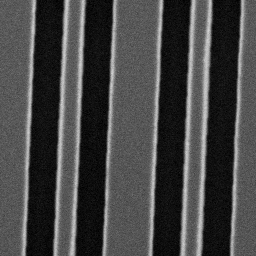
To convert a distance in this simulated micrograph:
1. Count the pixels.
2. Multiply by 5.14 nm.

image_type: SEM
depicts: lines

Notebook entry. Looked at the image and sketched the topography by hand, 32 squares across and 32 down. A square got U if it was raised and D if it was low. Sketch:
UUUUDDDDUUUDDDUUUUUUDDDDUUDDDDUU
UUUUDDDDUUUDDDUUUUUUDDDDUUDDDDUU
UUUUDDDDUUDDDDUUUUUUDDDDUUDDDDUU
UUUUDDDDUUDDDDUUUUUUDDDDUUDDDDUU
UUUUDDDDUUDDDDUUUUUUDDDDUUDDDDUU
UUUUDDDDUUDDDDUUUUUUDDDDUUDDDDUU
UUUUDDDDUUDDDDUUUUUUDDDDUUDDDDUU
UUUUDDDDUUDDDDUUUUUUDDDDUUDDDDUU
UUUUDDDDUUDDDDUUUUUUDDDDUUDDDDUU
UUUUDDDDUUDDDDUUUUUUDDDDUUDDDDUU
UUUUDDDDUUDDDDUUUUUUDDDDUUDDDDUU
UUUUDDDDUUDDDDUUUUUUDDDUUUDDDDUU
UUUUDDDDUUDDDDUUUUUUDDDUUUDDDDUU
UUUUDDDDUUDDDDUUUUUUDDDUUUDDDDUU
UUUUDDDUUUDDDDUUUUUUDDDUUUDDDDUU
UUUUDDDUUUDDDDUUUUUUDDDUUUDDDUUU
UUUUDDDUUUDDDUUUUUUUDDDUUUDDDUUU
UUUUDDDUUUDDDUUUUUUUDDDUUUDDDUUU
UUUUDDDUUUDDDUUUUUUDDDDUUUDDDUUU
UUUUDDDUUUDDDUUUUUUDDDDUUUDDDUUU
UUUUDDDUUUDDDUUUUUUDDDDUUUDDDUUU
UUUDDDDUUUDDDUUUUUUDDDDUUDDDDUUU
UUUDDDDUUUDDDUUUUUUDDDDUUDDDDUUU
UUUDDDDUUUDDDUUUUUUDDDDUUDDDDUUU
UUUDDDDUUUDDDUUUUUUDDDDUUDDDDUUU
UUUDDDDUUDDDDUUUUUUDDDDUUDDDDUUU
UUUDDDDUUDDDDUUUUUUDDDDUUDDDDUUU
UUUDDDDUUDDDDUUUUUUDDDDUUDDDDUUU
UUUDDDDUUDDDDUUUUUUDDDDUUDDDDUUU
UUUDDDDUUDDDDUUUUUUDDDDUUDDDDUUU
UUUDDDDUUDDDDUUUUUUDDDDUUDDDDUUU
UUUDDDDUUDDDDUUUUUUDDDDUUDDDDUUU